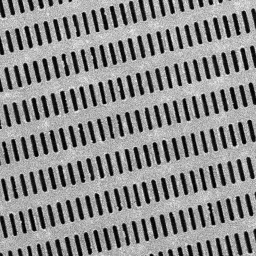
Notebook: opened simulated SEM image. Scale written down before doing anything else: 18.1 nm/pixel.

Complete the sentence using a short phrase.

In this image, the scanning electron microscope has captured a regular array of holes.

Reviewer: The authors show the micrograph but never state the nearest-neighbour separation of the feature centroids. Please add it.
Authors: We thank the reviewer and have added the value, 0.177 microns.